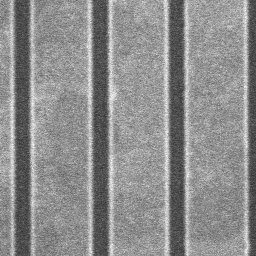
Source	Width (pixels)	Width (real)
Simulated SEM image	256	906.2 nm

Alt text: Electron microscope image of one or a few lines or trenches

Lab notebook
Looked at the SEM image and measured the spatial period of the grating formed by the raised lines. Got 0.275 um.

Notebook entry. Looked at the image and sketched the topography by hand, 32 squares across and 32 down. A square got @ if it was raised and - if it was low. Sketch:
@---@@@@@@@---@@@@@@@--@@@@@@@@-
@---@@@@@@@---@@@@@@@--@@@@@@@@-
@---@@@@@@@---@@@@@@@--@@@@@@@@-
@---@@@@@@@---@@@@@@@--@@@@@@@@-
@---@@@@@@@---@@@@@@@--@@@@@@@@-
@---@@@@@@@---@@@@@@@--@@@@@@@@-
@---@@@@@@@---@@@@@@@--@@@@@@@@-
@---@@@@@@@---@@@@@@@--@@@@@@@@-
@---@@@@@@@---@@@@@@@--@@@@@@@@-
@---@@@@@@@---@@@@@@@--@@@@@@@@-
@---@@@@@@@---@@@@@@@--@@@@@@@@-
@---@@@@@@@---@@@@@@@--@@@@@@@@-
@---@@@@@@@---@@@@@@@--@@@@@@@@-
@---@@@@@@@---@@@@@@@--@@@@@@@@-
@@--@@@@@@@---@@@@@@@--@@@@@@@@-
@@--@@@@@@@---@@@@@@@--@@@@@@@@-
@@--@@@@@@@---@@@@@@@--@@@@@@@@-
@@--@@@@@@@---@@@@@@@--@@@@@@@@-
@@--@@@@@@@---@@@@@@@--@@@@@@@@-
@@--@@@@@@@---@@@@@@@--@@@@@@@@-
@@--@@@@@@@---@@@@@@@--@@@@@@@@-
@@--@@@@@@@---@@@@@@@--@@@@@@@@-
@@--@@@@@@@---@@@@@@@--@@@@@@@@-
@@--@@@@@@@---@@@@@@@--@@@@@@@@-
@@--@@@@@@@---@@@@@@@--@@@@@@@@-
@@--@@@@@@@---@@@@@@@--@@@@@@@@-
@@--@@@@@@@---@@@@@@@--@@@@@@@@-
@@--@@@@@@@---@@@@@@@--@@@@@@@@-
@@--@@@@@@@---@@@@@@@--@@@@@@@@-
@@--@@@@@@@---@@@@@@@--@@@@@@@@-
@@--@@@@@@@---@@@@@@@--@@@@@@@@-
@@--@@@@@@@---@@@@@@@--@@@@@@@@-